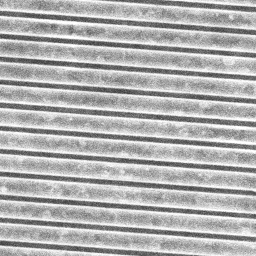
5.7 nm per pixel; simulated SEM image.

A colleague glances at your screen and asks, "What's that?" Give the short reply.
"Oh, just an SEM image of parallel lines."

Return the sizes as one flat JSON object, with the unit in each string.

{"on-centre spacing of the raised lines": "0.13 microns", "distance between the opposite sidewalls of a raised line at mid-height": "98.6 nm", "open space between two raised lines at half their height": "34.8 nm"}